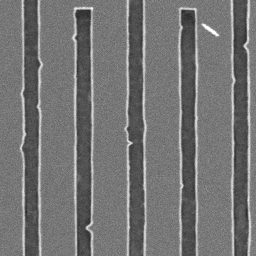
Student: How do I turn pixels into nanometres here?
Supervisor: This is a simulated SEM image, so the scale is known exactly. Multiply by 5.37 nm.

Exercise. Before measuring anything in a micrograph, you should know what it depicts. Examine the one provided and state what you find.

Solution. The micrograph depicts parallel lines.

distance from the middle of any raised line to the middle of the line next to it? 0.281 µm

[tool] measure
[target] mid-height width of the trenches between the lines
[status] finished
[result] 0.0792 µm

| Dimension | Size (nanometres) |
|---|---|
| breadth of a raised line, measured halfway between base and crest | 200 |